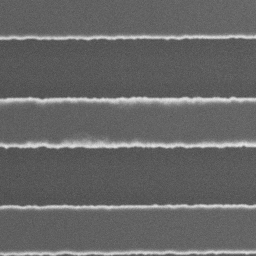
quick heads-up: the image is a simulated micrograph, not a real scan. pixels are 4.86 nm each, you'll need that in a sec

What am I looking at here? lines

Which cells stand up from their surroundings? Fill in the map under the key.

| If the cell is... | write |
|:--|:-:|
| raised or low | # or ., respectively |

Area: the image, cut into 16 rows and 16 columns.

################
################
................
................
................
................
################
################
################
................
................
................
................
################
################
################